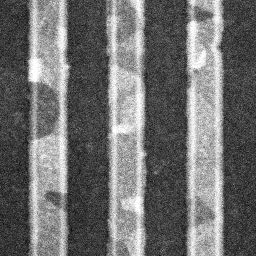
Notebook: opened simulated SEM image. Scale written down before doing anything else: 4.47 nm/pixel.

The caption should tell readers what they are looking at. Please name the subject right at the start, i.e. one or a few lines or trenches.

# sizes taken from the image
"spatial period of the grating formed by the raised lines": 0.349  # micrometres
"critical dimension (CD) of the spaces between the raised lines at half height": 235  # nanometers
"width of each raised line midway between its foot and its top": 111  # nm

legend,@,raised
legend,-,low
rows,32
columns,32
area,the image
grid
----@@@@------@@@-------@@@-----
----@@@@------@@@-------@@@-----
----@@@@------@@@-------@@@-----
----@@@@------@@@-------@@@-----
----@@@@------@@@-------@@@-----
----@@@@------@@@-------@@@-----
----@@@@------@@@-------@@@-----
----@@@@------@@@-------@@@-----
----@@@@------@@@-------@@@-----
----@@@@------@@@-------@@@-----
----@@@@------@@@-------@@@-----
----@@@@------@@@-------@@@-----
----@@@@------@@@-------@@@-----
----@@@@------@@@-------@@@-----
----@@@@------@@@-------@@@-----
----@@@@------@@@-------@@@-----
----@@@@------@@@-------@@@-----
----@@@@------@@@-------@@@-----
----@@@@------@@@-------@@@-----
----@@@@------@@@@------@@@-----
----@@@@------@@@-------@@@-----
----@@@@------@@@-------@@@-----
----@@@@------@@@-------@@@-----
----@@@@------@@@-------@@@-----
----@@@@------@@@-------@@@-----
----@@@@------@@@-------@@@-----
----@@@@------@@@-------@@@-----
----@@@@------@@@-------@@@-----
-----@@@------@@@-------@@@-----
----@@@@------@@@-------@@@-----
----@@@@------@@@-------@@@-----
----@@@@------@@@-------@@@-----